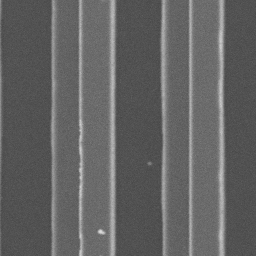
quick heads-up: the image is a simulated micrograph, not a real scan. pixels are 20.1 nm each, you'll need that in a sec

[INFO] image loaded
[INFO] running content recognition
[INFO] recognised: lines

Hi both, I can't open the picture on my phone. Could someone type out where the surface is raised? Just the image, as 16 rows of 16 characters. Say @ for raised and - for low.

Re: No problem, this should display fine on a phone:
---@@@@---@@@@--
---@@@@---@@@@--
---@@@@---@@@@--
---@@@@---@@@@--
---@@@@---@@@@--
---@@@@---@@@@--
---@@@@---@@@@--
---@@@@---@@@@--
---@@@@---@@@@--
---@@@@---@@@@--
---@@@@---@@@@--
---@@@@---@@@@--
---@@@@---@@@@--
---@@@@---@@@@--
---@@@@---@@@@--
---@@@@---@@@@--